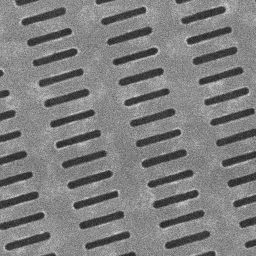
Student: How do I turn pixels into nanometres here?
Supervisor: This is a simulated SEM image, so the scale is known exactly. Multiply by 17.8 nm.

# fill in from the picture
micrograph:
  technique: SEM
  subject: a regular array of holes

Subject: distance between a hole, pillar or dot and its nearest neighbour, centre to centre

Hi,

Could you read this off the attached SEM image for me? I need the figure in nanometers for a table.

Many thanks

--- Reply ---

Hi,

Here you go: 376